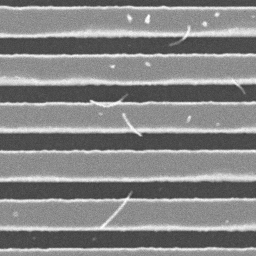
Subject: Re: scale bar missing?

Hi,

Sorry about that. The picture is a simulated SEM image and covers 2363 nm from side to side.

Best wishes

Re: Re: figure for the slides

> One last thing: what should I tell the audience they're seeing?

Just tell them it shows lines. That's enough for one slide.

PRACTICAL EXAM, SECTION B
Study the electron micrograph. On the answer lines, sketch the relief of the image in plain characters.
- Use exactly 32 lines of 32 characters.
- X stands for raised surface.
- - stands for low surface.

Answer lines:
--------------------------------
XXXXXXXXXXXXXXXXXXXXXXXXXXXXXXXX
XXXXXXXXXXXXXXXXXXXXXXXXXXXXXXXX
XXXXXXXXXXXXXXXXXXXXXXXXXXXXXXXX
XXXXXXXXXXXXXXXXXXXXXXXXXXXXX---
--------------------------------
--------------------------------
XXXXXXXXXXXXXXXXXXXXXXXXXXXXXXXX
XXXXXXXXXXXXXXXXXXXXXXXXXXXXXXXX
XXXXXXXXXXXXXXXXXXXXXXXXXXXXXXXX
XXXXXXXXXXXXXXXXXXXXXXXXXX-XXXX-
--------------------------------
--------------------------------
XXXXXXXXXXXXXXXXXXXXXXXXXXXXXXXX
XXXXXXXXXXXXXXXXXXXXXXXXXXXXXXXX
XXXXXXXXXXXXXXXXXXXXXXXXXXXXXXXX
XX---X--XXXXXX-XXX----XX-XX-XX--
--------------------------------
--------------------------------
XXXXXXXXXXXXXXXXXXXXXXXXXXXXXXXX
XXXXXXXXXXXXXXXXXXXXXXXXXXXXXXXX
XXXXXXXXXXXXXXXXXXXXXXXXXXXXXXXX
XXXXXXXXXXXXXXXXXXXXXXXXXXXXXXXX
--------------------------------
--------------------------------
XXXXXXXXXXXXXXXXXXXXXXXXXXXXXXXX
XXXXXXXXXXXXXXXXXXXXXXXXXXXXXXXX
XXXXXXXXXXXXXXXXXXXXXXXXXXXXXXXX
XXXXXXXXXXXXXXXXXXXXXXXXXXXXXXXX
--------------------------------
--------------------------------
XXXXXXXXXXXXXXXXXXXXXXXXXXXXXXXX